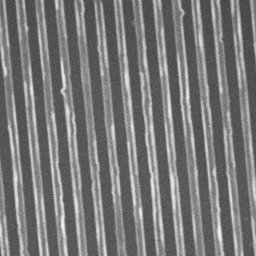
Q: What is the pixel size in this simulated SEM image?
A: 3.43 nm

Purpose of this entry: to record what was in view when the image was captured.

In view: parallel lines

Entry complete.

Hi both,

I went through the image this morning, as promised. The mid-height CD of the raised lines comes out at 26.9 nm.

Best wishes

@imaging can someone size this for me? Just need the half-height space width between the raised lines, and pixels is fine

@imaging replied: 11.7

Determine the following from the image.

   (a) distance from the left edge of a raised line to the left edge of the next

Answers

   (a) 66.6 nanometres